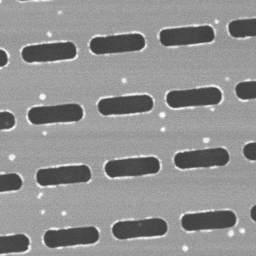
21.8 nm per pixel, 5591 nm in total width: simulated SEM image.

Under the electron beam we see a regular array of holes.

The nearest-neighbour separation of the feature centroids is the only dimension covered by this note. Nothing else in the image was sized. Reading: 1.35 microns